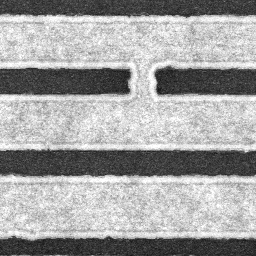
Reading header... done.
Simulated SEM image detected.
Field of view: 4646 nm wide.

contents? one or a few lines or trenches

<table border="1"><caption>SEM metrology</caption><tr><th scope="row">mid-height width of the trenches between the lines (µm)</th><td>0.61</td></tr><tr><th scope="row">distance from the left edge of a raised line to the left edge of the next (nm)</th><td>1500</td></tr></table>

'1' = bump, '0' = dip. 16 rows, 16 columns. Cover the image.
0000000000000000
1111111111111111
1111111111111111
1111111111111111
0000000011000000
0000000011000000
1111111111111111
1111111111111111
1111111111111111
0000000000000000
0000000000000000
1111111111111111
1111111111111111
1111111111111111
1111111111111111
0000000000000000